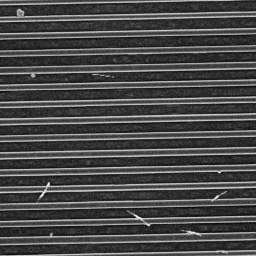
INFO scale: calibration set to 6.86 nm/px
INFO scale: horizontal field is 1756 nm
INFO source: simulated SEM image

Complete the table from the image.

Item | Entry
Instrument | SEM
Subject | parallel lines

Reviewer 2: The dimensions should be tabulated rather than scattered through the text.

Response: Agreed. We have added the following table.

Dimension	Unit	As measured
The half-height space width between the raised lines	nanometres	76.3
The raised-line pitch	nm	117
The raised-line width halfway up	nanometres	44.6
